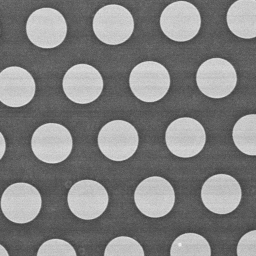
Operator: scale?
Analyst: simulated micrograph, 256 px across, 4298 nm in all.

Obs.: an array of small figures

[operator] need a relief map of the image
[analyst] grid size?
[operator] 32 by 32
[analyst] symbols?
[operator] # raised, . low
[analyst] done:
.....................###.....###
....###.....####....#####....###
....####....#####...#####...####
...#####....#####...#####....###
....####....####.....###......##
....###.......#.................
................................
..........................##....
.##......###.....####....####...
####....#####...#####....#####..
####....#####...#####....####...
####....#####....####....####...
####.....###......##............
................................
...............................#
......#......###.....####....###
....#####...#####....#####...###
#...#####...#####....#####...###
#...#####....####....####.....##
.....###.....###......##........
................................
................................
..................###.....###...
.###.....####....#####...#####..
#####....####....#####...#####..
#####....####....#####....####..
#####....####.....###......##...
.###............................
................................
.......................##.....##
.....####.....###.....####....##
#....####....#####...#####....##